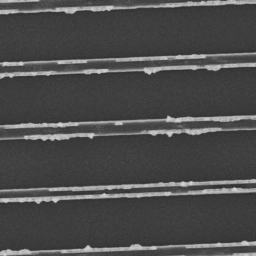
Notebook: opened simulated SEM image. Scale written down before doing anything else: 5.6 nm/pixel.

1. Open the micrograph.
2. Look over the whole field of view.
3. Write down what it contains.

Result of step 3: one or a few lines or trenches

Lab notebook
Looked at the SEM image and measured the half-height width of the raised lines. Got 0.0727 um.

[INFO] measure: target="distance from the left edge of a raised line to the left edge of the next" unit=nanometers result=353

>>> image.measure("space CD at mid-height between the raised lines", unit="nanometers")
277